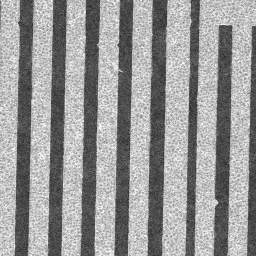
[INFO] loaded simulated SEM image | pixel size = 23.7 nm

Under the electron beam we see parallel lines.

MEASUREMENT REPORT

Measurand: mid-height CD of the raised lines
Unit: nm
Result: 450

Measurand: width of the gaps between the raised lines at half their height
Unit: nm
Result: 337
